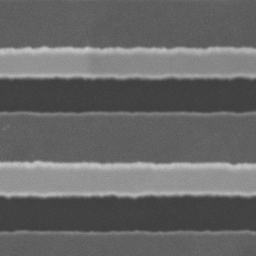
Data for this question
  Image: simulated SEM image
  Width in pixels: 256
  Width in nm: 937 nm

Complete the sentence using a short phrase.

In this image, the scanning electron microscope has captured lines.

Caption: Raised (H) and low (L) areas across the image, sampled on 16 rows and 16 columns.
HHHHHHHHHHHHHHHH
HHHHHHHHHHHHHHHH
HHHHHHHHHHHHHHHH
HHHHHHHHHHHHHHHH
HHHHHHHHHHHHHHHH
LLLLLLLLLLLLLLLL
LLLLLLLLLLLLLLLL
HHHHHHHHHHHHHHHH
HHHHHHHHHHHHHHHH
HHHHHHHHHHHHHHHH
HHHHHHHHHHHHHHHH
HHHHHHHHHHHHHHHH
LLLLLLLLLLLLLLLL
LLLLLLLLLLLLLLLL
HHHHHHHHHHHHHHHH
HHHHHHHHHHHHHHHH